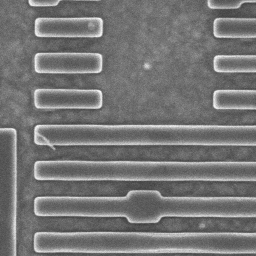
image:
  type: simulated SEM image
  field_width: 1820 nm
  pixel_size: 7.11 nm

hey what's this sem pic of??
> wiring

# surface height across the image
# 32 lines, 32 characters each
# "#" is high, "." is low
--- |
....###...................####..
................................
.....########..............#####
....#########..............#####
.....#######...............#####
................................
................................
....#########..............#####
....#########..............#####
................................
................................
....#########..............#####
....#########..............#####
...........................#####
................................
................................
##..############################
##..############################
##..............................
##..............................
##..############################
##..############################
##.........................#####
##..............................
##..............####............
##..############################
##..############################
##..............####............
##..............................
##..############################
##..############################
##.............######...########